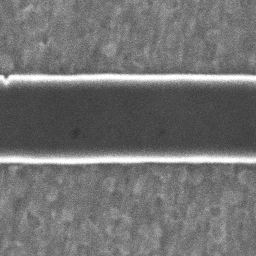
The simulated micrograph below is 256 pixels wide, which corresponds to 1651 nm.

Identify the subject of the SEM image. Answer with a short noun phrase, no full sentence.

one or a few lines or trenches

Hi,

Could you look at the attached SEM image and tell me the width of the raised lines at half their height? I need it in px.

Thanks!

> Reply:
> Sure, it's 84.4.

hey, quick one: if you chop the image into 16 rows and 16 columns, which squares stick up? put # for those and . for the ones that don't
................
................
................
................
................
################
################
################
################
################
................
................
................
................
................
................